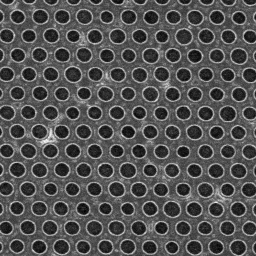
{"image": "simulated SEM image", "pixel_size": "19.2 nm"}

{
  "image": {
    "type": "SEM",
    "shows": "a regular array of holes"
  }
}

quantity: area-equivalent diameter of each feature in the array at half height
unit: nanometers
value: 271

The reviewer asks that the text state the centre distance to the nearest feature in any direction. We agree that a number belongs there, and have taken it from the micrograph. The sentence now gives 417 nm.